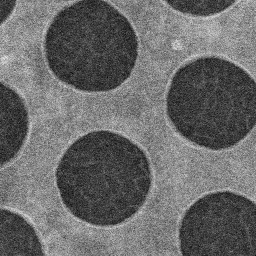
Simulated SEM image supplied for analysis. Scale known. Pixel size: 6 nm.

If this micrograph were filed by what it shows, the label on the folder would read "holes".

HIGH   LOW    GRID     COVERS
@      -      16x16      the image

-@@@---@@@@---@@
@@@-----@@@@@@@@
@@@------@@@@@@@
@@@------@@@@-@@
@@@-----@@@----@
-@@@---@@@@-----
--@@@@@@@@------
--@@@@@@@@@-----
--@@@---@@@----@
-@@@-----@@@@@@@
@@@@-----@@@@@@@
@@@@------@@@@@@
@@@@-----@@@----
-@@@@---@@@-----
--@@@@@@@@@-----
---@@@@@@@@-----